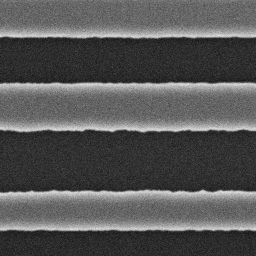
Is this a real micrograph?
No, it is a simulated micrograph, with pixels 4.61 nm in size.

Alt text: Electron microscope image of lines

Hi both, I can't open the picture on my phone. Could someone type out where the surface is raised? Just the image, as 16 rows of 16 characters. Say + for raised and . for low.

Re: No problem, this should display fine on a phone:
++++++++++++++++
++++++++++++++++
................
................
................
++++++++++++++++
++++++++++++++++
++++++++++++++++
................
................
................
................
++++++++++++++++
++++++++++++++++
................
................